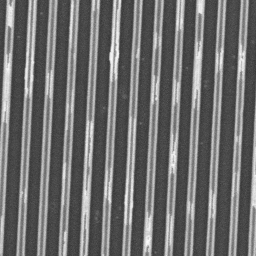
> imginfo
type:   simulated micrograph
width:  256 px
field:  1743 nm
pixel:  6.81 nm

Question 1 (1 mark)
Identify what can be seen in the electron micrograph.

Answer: parallel lines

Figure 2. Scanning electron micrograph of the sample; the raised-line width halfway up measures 39.1 nm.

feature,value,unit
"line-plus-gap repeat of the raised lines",0.144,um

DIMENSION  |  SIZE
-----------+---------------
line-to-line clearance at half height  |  105 nm